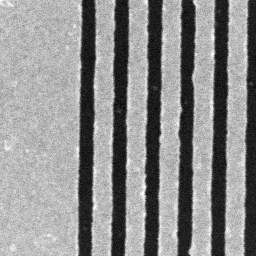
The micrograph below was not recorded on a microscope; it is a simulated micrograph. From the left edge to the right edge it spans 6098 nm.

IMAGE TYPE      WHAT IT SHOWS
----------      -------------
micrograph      parallel lines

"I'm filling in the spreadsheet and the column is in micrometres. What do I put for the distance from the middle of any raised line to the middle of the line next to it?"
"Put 0.792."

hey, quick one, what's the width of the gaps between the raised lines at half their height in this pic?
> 372 nm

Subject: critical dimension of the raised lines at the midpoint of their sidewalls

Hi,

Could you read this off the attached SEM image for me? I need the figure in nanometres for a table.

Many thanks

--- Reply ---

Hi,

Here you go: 417